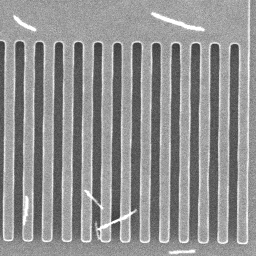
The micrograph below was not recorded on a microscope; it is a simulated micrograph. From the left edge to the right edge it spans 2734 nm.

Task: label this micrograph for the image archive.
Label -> groups of lines, slits or small figures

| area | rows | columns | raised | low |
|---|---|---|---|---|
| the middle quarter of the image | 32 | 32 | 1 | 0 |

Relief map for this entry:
11000110001100011001110011100110
11000110001100011001110011100110
11000110001100011001110011100110
11000110001100011001110011100110
11000110001100011001110011100110
11000110001100011001110011100110
11000110001100011001110011100110
11000110001100011001110011100110
11000110001100011001110011100110
11000110001100111001110011100110
11000110001100111001110011000110
11000110011100111001110011000110
11000110011100111001110011000110
11000110011100111001110011000110
11000110001100111001110011000110
11000110001100111001110011000110
11000110001100111001110011000110
11000110001100111001110011000110
11000110001100111001100011000110
11000110001100111001100011000110
11000110001100111001110011000110
11000110001100111001110011000110
11000110001100111001110011000110
11000110001100111001110011000110
11000110001100111001100011000110
11000110011100111001100011000110
11000110011100111001100011000110
11000110011100111001100011000110
11000110011100111001100011000110
11000110011100111001100011000110
11000110011100111001100011000110
11000110011100111001100011000110